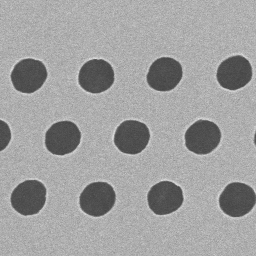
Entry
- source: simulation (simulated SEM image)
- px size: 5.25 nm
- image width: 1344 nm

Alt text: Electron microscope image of a regular array of holes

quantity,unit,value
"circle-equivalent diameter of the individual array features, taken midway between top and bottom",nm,183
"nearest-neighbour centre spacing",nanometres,359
